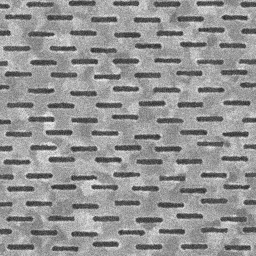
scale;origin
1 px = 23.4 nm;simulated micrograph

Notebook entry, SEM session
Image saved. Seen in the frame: a regular array of holes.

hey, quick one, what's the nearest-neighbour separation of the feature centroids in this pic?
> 559 nm